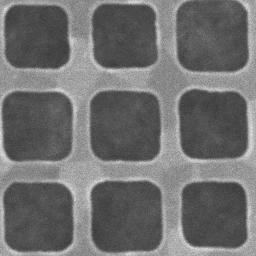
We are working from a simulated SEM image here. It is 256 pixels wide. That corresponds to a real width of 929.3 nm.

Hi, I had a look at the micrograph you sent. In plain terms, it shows a regular array of holes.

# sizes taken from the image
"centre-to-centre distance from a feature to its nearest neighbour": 319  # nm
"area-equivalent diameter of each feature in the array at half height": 276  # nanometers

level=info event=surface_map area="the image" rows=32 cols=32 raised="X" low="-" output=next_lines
XX-XXXXXXXXXX-----XXXXX-------XX
X-------XXXX-------XXX---------X
X-------XXX--------XXX---------X
X--------XXX-------XXX---------X
X--------XX---------XX---------X
X--------XXX--------XX---------X
X--------XXX--------XX---------X
X--------XXX--------XX---------X
XX------XXXXX-----XXXXX-------XX
XXXXXXXXXXXXXXXXXXXXXXXXXXXXXXXX
XXXXXXXXXXXXXXXXXXXXXXXXXXXXXXXX
XX-----XXXXXX-----XXXXX-------XX
---------XX---------XX---------X
---------XX---------XX---------X
---------XX---------XX---------X
---------XX---------XX---------X
---------XX---------XX---------X
---------XX---------XX---------X
---------XX---------XXX--------X
X-------XXXX--------XXX-------XX
XXXXXXXXXXXXXXXXXXXXXXXXXXXXXXXX
XXXXXXXXXXXXXXXXXXXXXXXXXXXXXXXX
XXXXXXXXXXXXXXXXXXXXXXXXXXXXXXXX
X-------XXXX--------XXX-------XX
---------XX---------XXX--------X
---------XX---------XXX--------X
---------XX---------XXX--------X
---------XX---------XXX--------X
---------XX---------XXX--------X
X--------XX---------XXX--------X
X--------XXX--------XXXX------XX
XXX-XX-XXXXXX---XX-XXXXXXXXXXXXX